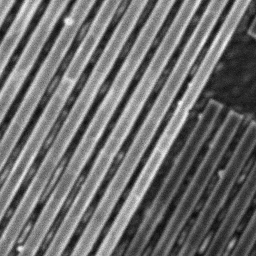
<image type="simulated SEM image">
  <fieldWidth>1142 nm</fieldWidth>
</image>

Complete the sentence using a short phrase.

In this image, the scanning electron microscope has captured parallel lines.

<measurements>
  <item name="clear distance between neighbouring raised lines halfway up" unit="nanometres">41.5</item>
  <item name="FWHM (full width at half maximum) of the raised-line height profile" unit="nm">62.1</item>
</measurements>